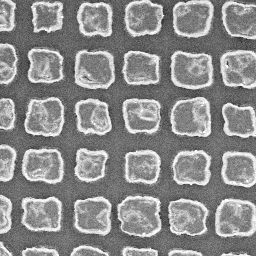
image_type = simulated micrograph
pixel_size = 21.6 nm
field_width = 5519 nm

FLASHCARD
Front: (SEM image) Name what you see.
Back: a regular array of raised bodies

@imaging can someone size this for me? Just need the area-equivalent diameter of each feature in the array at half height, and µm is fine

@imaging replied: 0.785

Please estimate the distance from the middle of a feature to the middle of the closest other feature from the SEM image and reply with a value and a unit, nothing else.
1030 nanometers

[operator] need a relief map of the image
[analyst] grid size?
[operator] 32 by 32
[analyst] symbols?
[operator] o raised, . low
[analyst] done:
o....o..........ooo...oooo..oo..
oo..ooo...oooo..oooo..oooo..oooo
o...ooo...oooo..oooo..oooo..oooo
o...ooo...oooo..oooo..oooo..oooo
..............................oo
................................
oo..ooo...o.....o...............
oo..oooo..oooo..oooo..oooo..oooo
oo..oooo..oooo..oooo..oooo..oooo
oo..oooo...ooo..oooo..oooo..oooo
..........oooo........oooo...ooo
................................
o.....o.........o.......o.......
oo..oooo..ooo...oooo..oooo..oo..
oo.ooooo..oooo..oooo..oooo..oooo
oo.ooooo..oooo..oooo..oooo..oooo
....ooo.....o.........oooo...ooo
................................
o...............................
oo.oooo...ooo...ooo...oooo..ooo.
oo.ooooo..ooo...oooo..oooo..oooo
oo.ooooo..ooo...oooo..oooo..oooo
.....oo.........ooo...oooo..oooo
................................
................................
o..oooo...oooo.ooooo.oooo...ooo.
o..ooooo.ooooo.ooooo.ooooo.ooooo
o..ooooo..oooo.ooooo.ooooo.ooooo
o...ooo...oooo.ooooo.ooooo.ooooo
................................
................................
o..oooo..oooo...ooo...o.........